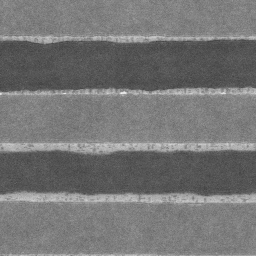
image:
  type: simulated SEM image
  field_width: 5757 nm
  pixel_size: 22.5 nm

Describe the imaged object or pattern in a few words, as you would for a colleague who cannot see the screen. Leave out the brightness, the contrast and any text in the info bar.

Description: lines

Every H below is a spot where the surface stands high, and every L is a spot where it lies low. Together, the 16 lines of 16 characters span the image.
HHHHHHHHHHHHHHHH
HHHHHHHHHHHHHHHH
LLLLLLLLLLLLLLLL
LLLLLLLLLLLLLLLL
LLLLLLLLLLLLLLLL
LLLLLLLLLLLLLLLL
HHHHHHHHHHHHHHHH
HHHHHHHHHHHHHHHH
HHHHHHHHHHHHHHHH
LLLLLLLLLLLLLLLL
LLLLLLLLLLLLLLLL
LLLLLLLLLLLLLLLL
HHHHHHHHHHHHHLLL
HHHHHHHHHHHHHHHH
HHHHHHHHHHHHHHHH
HHHHHHHHHHHHHHHH